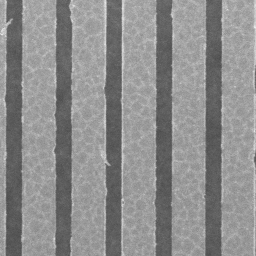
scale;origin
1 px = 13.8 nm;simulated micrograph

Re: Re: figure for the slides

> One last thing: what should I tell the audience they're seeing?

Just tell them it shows parallel lines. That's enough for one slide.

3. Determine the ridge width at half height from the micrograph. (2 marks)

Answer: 457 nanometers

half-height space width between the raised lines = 228 nm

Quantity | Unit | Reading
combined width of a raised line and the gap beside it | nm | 689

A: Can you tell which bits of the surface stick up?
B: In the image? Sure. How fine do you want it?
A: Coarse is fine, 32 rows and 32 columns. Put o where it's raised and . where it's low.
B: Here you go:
o..oooo..oooo..oooo...oooo..oooo
o..oooo..oooo..oooo..ooooo..oooo
o..oooo..oooo..oooo...oooo..oooo
o..oooo..oooo..oooo...oooo..oooo
o..oooo..oooo..oooo...oooo..oooo
o..oooo..oooo..oooo...oooo..oooo
o..oooo..oooo..oooo...oooo..oooo
o..oooo..oooo..oooo...oooo..oooo
o..oooo..oooo..oooo...oooo..oooo
o..oooo..oooo..oooo...oooo..oooo
o..oooo..oooo..oooo...oooo..oooo
o..oooo..oooo..oooo...oooo..oooo
o..oooo..oooo..oooo...oooo..oooo
o..oooo..oooo..oooo...oooo..oooo
o..oooo..oooo..oooo...oooo..oooo
o..oooo..oooo..oooo...oooo..oooo
o..oooo..oooo..oooo...oooo..oooo
o..oooo..oooo..oooo...oooo..oooo
o..oooo..oooo..oooo...oooo..oooo
o..oooo..oooo..oooo...oooo..oooo
o..oooo..oooo..ooooo..oooo..oooo
o..oooo..oooo..oooo...oooo..oooo
o..oooo..oooo..ooooo..oooo..oooo
o..oooo..oooo..oooo...oooo..oooo
o..oooo..oooo..oooo...oooo..oooo
o..oooo..oooo..oooo...oooo..oooo
o..oooo..oooo..oooo...oooo..oooo
o..oooo..oooo..oooo...oooo..oooo
o..oooo..oooo..oooo...oooo..oooo
o..oooo..oooo..oooo...oooo..oooo
o..oooo..oooo..oooo...oooo..oooo
o..oooo..oooo..oooo...oooo..oooo